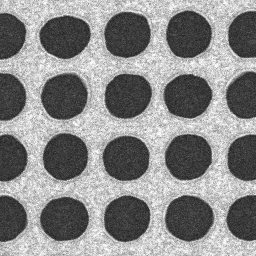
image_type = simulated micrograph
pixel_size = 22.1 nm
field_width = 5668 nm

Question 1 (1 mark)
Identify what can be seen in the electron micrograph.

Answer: a regular array of holes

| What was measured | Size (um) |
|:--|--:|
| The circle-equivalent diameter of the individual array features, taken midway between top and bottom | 1.04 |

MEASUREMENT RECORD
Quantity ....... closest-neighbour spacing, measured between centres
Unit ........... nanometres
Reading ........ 1330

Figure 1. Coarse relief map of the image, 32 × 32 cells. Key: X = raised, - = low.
XXXXXXXXXXXXXXXXXXXXXXXXXXXXXXXX
XXXXXXXXXXXXXXX-XXXXXX--XXXXXXX-
--XXXX----XXXX----XXX-----XXX---
---XX------XX------XX-----XXX---
---XX------XX------XX-----XX----
---XX------XX------XX-----XXX---
--XXXX----XXXX----XXX----XXXX---
XXXXXXXXXXXXXXXXXXXXXXXXXXXXXXXX
XXXXXXXXXXXXXXXXXXXXXXXXXXXXXXXX
--XXXXX---XXXXX---XXXX---XXXXX--
---XXX-----XX------XX-----XXX---
---XX------XX------X------XX----
---XX------XX------X------XX----
---XXX-----XX-----XXX-----XXX---
--XXXX----XXXX---XXXXX---XXXX---
XXXXXXXXXXXXXXXXXXXXXXXXXXXXXXXX
XXXXXXXXXXXXXXXXXXXXXXXXXXXXXXXX
--XXXX----XXXX----XXX-----XXX---
---XXX-----XX-----XXX-----XXX---
---XX------XX------XX------X----
---XX------XX------XX-----XX----
---XXX----XXX-----XXX-----XXX---
--XXXXXXXXXXXXX--XXXXX--XXXXXX--
XXXXXXXXXXXXXXXXXXXXXXXXXXXXXXXX
-XXXXXXXXXXXXXX--XXXXXX-XXXXXXX-
---XXX----XXXX----XXX-----XXX---
---XX------XX------XX------X----
---XX------XX------XX------X----
---XX------XX-----XXX-----XXX---
--XXXX----XXXX----XXXX----XXX---
XXXXXXXXXXXXXXXXXXXXXXXXXXXXXXXX
XXXXXXXXXXXXXXXXXXXXXXXXXXXXXXXX